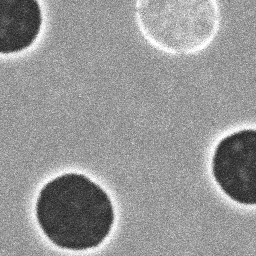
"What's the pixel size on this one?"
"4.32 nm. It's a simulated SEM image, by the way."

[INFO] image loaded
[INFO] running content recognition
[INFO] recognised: holes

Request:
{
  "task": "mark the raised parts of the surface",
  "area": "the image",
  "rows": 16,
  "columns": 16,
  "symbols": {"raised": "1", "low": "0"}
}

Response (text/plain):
0001111111111111
0001111111111111
0011111111111111
1111111111111111
1111111111111111
1111111111111111
1111111111111111
1111111111111111
1111111111111100
1111111111111000
1111111111111000
1110001111111100
1100000111111110
1100000111111111
1110000111111111
1111001111111111